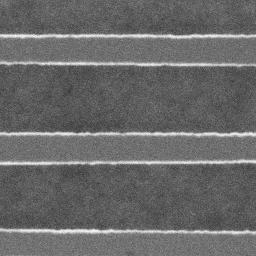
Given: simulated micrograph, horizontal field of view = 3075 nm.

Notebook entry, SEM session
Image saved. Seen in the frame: lines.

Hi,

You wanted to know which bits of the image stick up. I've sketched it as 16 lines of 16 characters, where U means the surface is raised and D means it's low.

DDDDDDDDDDDDDDDD
DDDDDDDDDDDDDDDD
UUUUUUUUUUUUUUUU
UUUUUUUUUUUUUUUU
DDDDDDDDDDDDDDDD
DDDDDDDDDDDDDDDD
DDDDDDDDDDDDDDDD
DDDDDDDDDDDDDDDD
UUUUUUUUUUUUUUUU
UUUUUUUUUUUUUUUU
DDDDDDDDDDDDDDDD
DDDDDDDDDDDDDDDD
DDDDDDDDDDDDDDDD
DDDDDDDDDDDDDDDD
UUUUUUUUUUUUUDUU
UUUUUUUUUUUUUUUU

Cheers